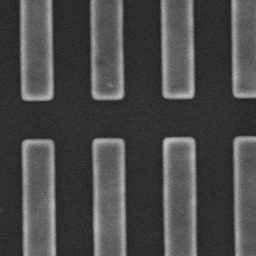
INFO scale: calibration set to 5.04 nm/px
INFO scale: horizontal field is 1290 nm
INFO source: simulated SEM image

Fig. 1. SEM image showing groups of lines, slits or small figures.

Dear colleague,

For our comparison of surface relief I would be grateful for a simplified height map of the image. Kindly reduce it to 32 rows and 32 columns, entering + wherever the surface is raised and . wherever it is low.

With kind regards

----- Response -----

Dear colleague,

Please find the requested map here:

...+++.....++++.....++++.....+++
...+++.....++++.....++++.....+++
...+++.....++++.....++++.....+++
...+++.....++++.....++++.....+++
...+++.....++++.....++++.....+++
...+++......+++.....++++.....+++
...+++......+++.....++++.....+++
...++++.....+++.....++++.....+++
...++++.....+++.....++++.....+++
...++++.....+++.....++++.....+++
...++++.....+++.....++++.....+++
...++++.....+++.....++++.....+++
................................
................................
................................
................................
................................
............+++......+++......++
...++++.....+++......+++.....+++
...++++.....+++......+++.....+++
...++++.....+++......+++.....+++
...++++.....+++......+++.....+++
...++++.....+++......+++.....+++
...++++.....+++......+++.....+++
...++++.....+++......+++.....+++
...++++.....+++......+++.....+++
...++++.....+++......+++.....+++
...++++.....++++.....+++.....+++
...++++.....++++.....+++......++
...++++.....++++.....+++......++
...++++.....++++.....+++......++
...++++.....++++.....+++......++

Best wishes